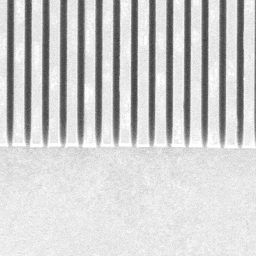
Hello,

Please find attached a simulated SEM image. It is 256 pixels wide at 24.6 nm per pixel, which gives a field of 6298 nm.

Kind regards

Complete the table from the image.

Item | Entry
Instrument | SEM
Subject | parallel lines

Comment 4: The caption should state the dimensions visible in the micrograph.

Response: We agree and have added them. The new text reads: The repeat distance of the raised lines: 0.435 microns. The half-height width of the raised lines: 274 nm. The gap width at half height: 160 nm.